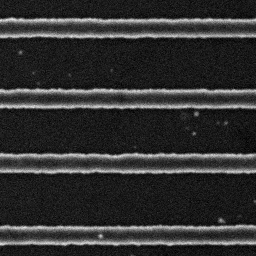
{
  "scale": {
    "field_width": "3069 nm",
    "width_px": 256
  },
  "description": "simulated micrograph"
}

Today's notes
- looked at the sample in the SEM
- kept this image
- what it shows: lines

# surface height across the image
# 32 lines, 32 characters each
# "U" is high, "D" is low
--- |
DDDDDDDDDDDDDDDDDDDDDDDDDDDDDDDD
DDDDDDDDDDDDDDDDDDDDDDDDDDDDDDDD
UUUDUUUUUUUUUDDDUDDUUDDUUUUUUDDU
UUUUUUUUUUUUUUUUUUUUUUUUUUUUUUUU
UUUUUUUUUUUUUUUUUUUUUUUUUUUUUUUU
DDDDDDDDDDDDDDDDDDDDDDDDDDDDDDDD
DDDDDDDDDDDDDDDDDDDDDDDDDDDDDDDD
DDDDDDDDDDDDDDDDDDDDDDDDDDDDDDDD
DDDDDDDDDDDDDDDDDDDDDDDDDDDDDDDD
DDDDDDDDDDDDDDDDDDDDDDDDDDDDDDDD
DDDDDDDDDDDDDDDDDDDDDDDDDDDDDDDD
UUUUUUUUUUUUUUUUUUUUUUUUUUUUUUUU
UUUUUUUUUUUUUUUUUUUUUUUUUUUUUUUU
DDDDDDDDDDDDDDDDDDDDDDDDDDDDDDDD
DDDDDDDDDDDDDDDDDDDDDDDDDDDDDDDD
DDDDDDDDDDDDDDDDDDDDDDDDDDDDDDDD
DDDDDDDDDDDDDDDDDDDDDDDDDDDDDDDD
DDDDDDDDDDDDDDDDDDDDDDDDDDDDDDDD
DDDDDDDDDDDDDDDDDDDDDDDDDDDDDDDD
UUUUUUUUUUUUUUUUUUUUUUUUUUUUUUUU
UUUUUUUUUUUUUUUUUUUUUUUUUUUUUUUU
DDDDUUUDDDUDDDDUUUDUUUDDDDDDUUUU
DDDDDDDDDDDDDDDDDDDDDDDDDDDDDDDD
DDDDDDDDDDDDDDDDDDDDDDDDDDDDDDDD
DDDDDDDDDDDDDDDDDDDDDDDDDDDDDDDD
DDDDDDDDDDDDDDDDDDDDDDDDDDDDDDDD
DDDDDDDDDDDDDDDDDDDDDDDDDDDDDDDD
DDDDDDDDDDDDDDDDDDDDDDDDDDDDDDDD
UUUUUUUUUUUUUUUUUUUUUUUUUUUUUUUU
UUUUUUUUUUUUUUUUUUUUUUUUUUUUUUUU
UDDDDDDUUDDDDDUDDUDDDUDDDDDDDDDD
DDDDDDDDDDDDDDDDDDDDDDDDDDDDDDDD